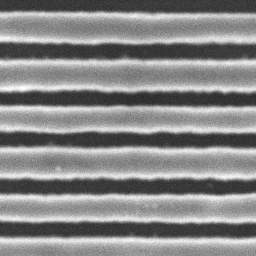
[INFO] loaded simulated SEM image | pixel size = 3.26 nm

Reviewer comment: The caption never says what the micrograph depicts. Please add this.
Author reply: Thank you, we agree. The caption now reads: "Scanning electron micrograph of lines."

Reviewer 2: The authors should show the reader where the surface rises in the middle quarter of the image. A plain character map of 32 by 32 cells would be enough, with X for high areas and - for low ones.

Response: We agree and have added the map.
XXXXXXXXXXXXXXXXXXXXXXXXXXXXXXXX
XXXXXXXXXXXXXXXXXXXXXXXXXXXXXXXX
XXXXXXXXXXXXXXXXXXXXXXXXXXXXXXXX
XXXXXXXXXXXXXXXXXXXXXXXXXXXXXXXX
XXXXXXXXXXXXXXXXXXXXXXXXXXXXXXXX
XXXXXXXXXXXXXXXXXXXXXXXXXXXXXXXX
-XXX--XXXXXXXXXXXXXXXXXXXXXXXXXX
--------------------------------
--------------------------------
--------------------------------
--------------------------------
XXXXXXXXXXXXXXXXXXXXXXXXXXXXXXXX
XXXXXXXXXXXXXXXXXXXXXXXXXXXXXXXX
XXXXXXXXXXXXXXXXXXXXXXXXXXXXXXXX
XXXXXXXXXXXXXXXXXXXXXXXXXXXXXXXX
XXXXXXXXXXXXXXXXXXXXXXXXXXXXXXXX
XXXXXXXXXXXXXXXXXXXXXXXXXXXXXXXX
--------------------------------
--------------------------------
--------------------------------
--------------------------------
XXXXXXXXXXXXXXXXXXXXXXXXXXXXXXXX
XXXXXXXXXXXXXXXXXXXXXXXXXXXXXXXX
XXXXXXXXXXXXXXXXXXXXXXXXXXXXXXXX
XXXXXXXXXXXXXXXXXXXXXXXXXXXXXXXX
XXXXXXXXXXXXXXXXXXXXXXXXXXXXXXXX
XXXXXXXXXXXXXXXXXXXXXXXXXXXXXXXX
XXXXXXXXXXXXXXXXXXXXXXXXXXXXXXXX
-X-----X----XXX----X-X---X------
--------------------------------
--------------------------------
--------------------------------